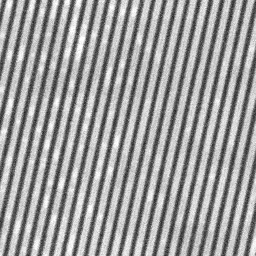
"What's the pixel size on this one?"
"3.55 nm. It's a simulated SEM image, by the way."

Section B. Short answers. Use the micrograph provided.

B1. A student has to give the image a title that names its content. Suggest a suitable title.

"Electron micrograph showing parallel lines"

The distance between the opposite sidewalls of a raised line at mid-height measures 16.4 nanometres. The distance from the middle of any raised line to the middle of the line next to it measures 39.7 nm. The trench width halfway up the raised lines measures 23.4 nanometres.